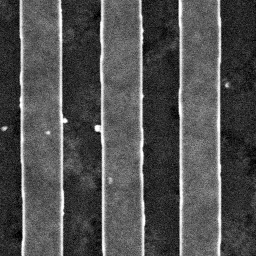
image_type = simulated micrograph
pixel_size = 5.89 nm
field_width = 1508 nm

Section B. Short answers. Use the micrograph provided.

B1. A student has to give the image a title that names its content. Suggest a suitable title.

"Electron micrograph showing lines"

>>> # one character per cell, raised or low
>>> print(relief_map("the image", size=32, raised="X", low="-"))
---XXXXX-----XXXXX----XXXXX-----
---XXXXX-----XXXXX----XXXXX-----
---XXXXX-----XXXXX----XXXXXX----
---XXXXX-----XXXXX----XXXXXX----
---XXXXX-----XXXXX-----XXXXX----
---XXXXX-----XXXXX-----XXXXX----
---XXXXX-----XXXXX-----XXXXX----
---XXXXX-----XXXXX-----XXXXX----
---XXXXX-----XXXXX-----XXXX-----
---XXXXX-----XXXXX-----XXXX-----
---XXXXX-----XXXXX-----XXXX-----
---XXXXX-----XXXXX----XXXXX-----
---XXXXX-----XXXXX----XXXXX-----
---XXXXX-----XXXXX----XXXXX-----
---XXXXX-----XXXXX----XXXXX-----
---XXXXX-----XXXXX-----XXXX-----
---XXXXX-----XXXXX-----XXXX-----
---XXXXX-----XXXXX-----XXXX-----
---XXXXX-----XXXXX-----XXXX-----
---XXXXX-----XXXXX-----XXXX-----
---XXXXX-----XXXXX-----XXXXX----
---XXXXX-----XXXXX-----XXXXX----
---XXXXX-----XXXXX-----XXXXX----
---XXXXX-----XXXXX-----XXXXX----
---XXXXX-----XXXXX-----XXXXX----
---XXXXX-----XXXXX-----XXXXX----
---XXXXX-----XXXXX-----XXXXX----
---XXXXX-----XXXXX-----XXXXX----
---XXXXX-----XXXXX-----XXXXX----
---XXXXX-----XXXXX-----XXXXX----
---XXXXX-----XXXXX-----XXXXX----
---XXXXX-----XXXXX-----XXXX-----